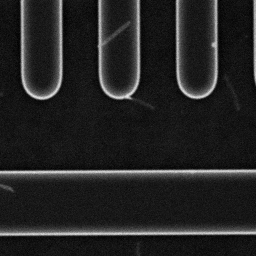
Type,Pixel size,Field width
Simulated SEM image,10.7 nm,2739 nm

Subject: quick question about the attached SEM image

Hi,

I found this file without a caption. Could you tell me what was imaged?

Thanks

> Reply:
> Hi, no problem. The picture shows groups of lines, slits or small figures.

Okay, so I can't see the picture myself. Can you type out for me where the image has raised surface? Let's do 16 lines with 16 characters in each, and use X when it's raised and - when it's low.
-XXX--XXX--XX---
-XXX--XXX--XX---
-XXX--XXX--XXX--
-XXX--XXX--XX---
-XXX--XXX--XX---
--XX---X---XX---
----------------
----------------
----------------
----------------
----------------
XXXXXXXXXXXXXXXX
XXXXXXXXXXXXXXXX
XXXXXXXXXXXXXXXX
XXXXXXXXXXXXXXXX
----------------